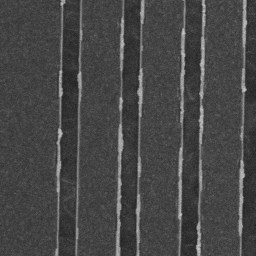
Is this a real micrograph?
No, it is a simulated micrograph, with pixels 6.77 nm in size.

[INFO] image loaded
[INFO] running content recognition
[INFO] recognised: one or a few lines or trenches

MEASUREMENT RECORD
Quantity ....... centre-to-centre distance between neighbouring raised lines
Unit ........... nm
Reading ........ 412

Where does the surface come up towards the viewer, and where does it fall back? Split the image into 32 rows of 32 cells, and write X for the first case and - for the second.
XXXXXXXX--XXXXX---XXXXX--XXXXXX-
XXXXXXXX--XXXXX---XXXXX--XXXXXX-
XXXXXXXX--XXXXX---XXXXX--XXXXXX-
XXXXXXXX--XXXXX---XXXXX--XXXXXX-
XXXXXXXX--XXXXX---XXXXX--XXXXXX-
XXXXXXXX--XXXXX---XXXXX--XXXXXX-
XXXXXXXX--XXXXX---XXXXX--XXXXXX-
XXXXXXXX--XXXXX---XXXXX--XXXXX--
XXXXXXXX--XXXXX---XXXXX--XXXXXX-
XXXXXXXX--XXXXX--XXXXXX--XXXXXX-
XXXXXXXX--XXXXX--XXXXXX--XXXXXX-
XXXXXXXX--XXXXX--XXXXXX--XXXXXX-
XXXXXXXX--XXXXX--XXXXXX--XXXXX--
XXXXXXX---XXXXX--XXXXXX--XXXXX--
XXXXXXX---XXXXX--XXXXXX--XXXXX--
XXXXXXX---XXXXX--XXXXXX--XXXXX--
XXXXXXXX--XXXXX--XXXXXX--XXXXX--
XXXXXXXX--XXXXX--XXXXXX--XXXXX--
XXXXXXX---XXXXX--XXXXXX--XXXXX--
XXXXXXX---XXXXX--XXXXXX--XXXXX--
XXXXXXXX--XXXXX--XXXXXX--XXXXX--
XXXXXXX---XXXXX--XXXXXX--XXXXXX-
XXXXXXX---XXXXX--XXXXXX--XXXXX--
XXXXXXX---XXXXX--XXXXXX--XXXXX--
XXXXXXX---XXXXX--XXXXXX--XXXXX--
XXXXXXX---XXXXX--XXXXXX--XXXXX--
XXXXXXX---XXXXX--XXXXXX--XXXXX--
XXXXXXX---XXXXX--XXXXXX--XXXXX--
XXXXXXX---XXXXX--XXXXXX--XXXXX--
XXXXXXX---XXXXX--XXXXXX--XXXXX--
XXXXXXX---XXXXX--XXXXXX--XXXXX--
XXXXXXX---XXXXX--XXXXX---XXXXX--